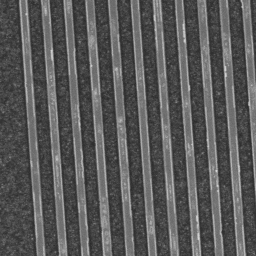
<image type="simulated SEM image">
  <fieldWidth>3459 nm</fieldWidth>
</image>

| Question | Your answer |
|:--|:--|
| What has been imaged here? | parallel lines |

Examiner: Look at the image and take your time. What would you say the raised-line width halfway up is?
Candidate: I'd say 106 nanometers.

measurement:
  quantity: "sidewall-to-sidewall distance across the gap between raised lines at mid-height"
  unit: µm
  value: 0.199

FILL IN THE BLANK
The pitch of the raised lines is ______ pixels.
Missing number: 22.2